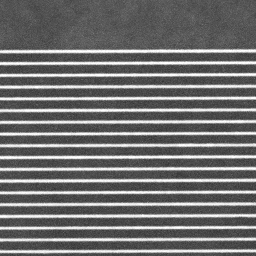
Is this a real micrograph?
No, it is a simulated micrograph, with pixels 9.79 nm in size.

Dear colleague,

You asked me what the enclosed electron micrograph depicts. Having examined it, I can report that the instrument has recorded parallel lines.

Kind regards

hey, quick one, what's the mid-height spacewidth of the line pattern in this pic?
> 99.1 nanometres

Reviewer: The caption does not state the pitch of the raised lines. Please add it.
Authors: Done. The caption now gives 115 nm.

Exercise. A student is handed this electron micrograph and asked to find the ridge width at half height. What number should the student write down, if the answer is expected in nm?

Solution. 18.4